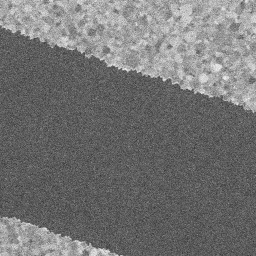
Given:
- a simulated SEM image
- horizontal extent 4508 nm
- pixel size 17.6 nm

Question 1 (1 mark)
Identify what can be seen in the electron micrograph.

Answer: one or a few lines or trenches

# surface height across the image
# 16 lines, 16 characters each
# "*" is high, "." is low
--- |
****************
****************
...*************
......**********
.........*******
............****
...............*
................
................
................
................
................
................
................
***.............
******..........